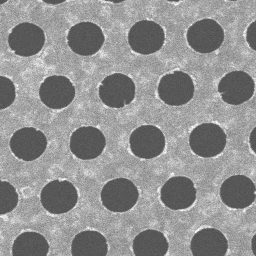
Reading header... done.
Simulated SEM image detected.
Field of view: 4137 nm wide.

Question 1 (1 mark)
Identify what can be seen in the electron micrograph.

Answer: a regular array of holes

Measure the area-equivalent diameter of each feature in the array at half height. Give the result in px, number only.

35.9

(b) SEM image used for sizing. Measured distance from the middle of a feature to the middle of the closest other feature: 959 nm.